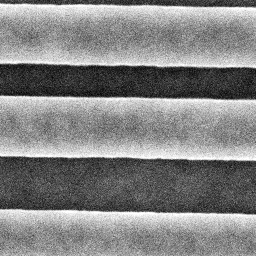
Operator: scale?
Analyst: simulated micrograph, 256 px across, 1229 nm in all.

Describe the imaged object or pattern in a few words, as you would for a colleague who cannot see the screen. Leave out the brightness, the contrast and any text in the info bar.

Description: lines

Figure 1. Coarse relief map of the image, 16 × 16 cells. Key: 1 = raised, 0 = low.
1111111111111110
1111111111111111
1111111111111111
1111111111111111
0000000000000000
0000000000000000
1111111111111111
1111111111111111
1111111111111111
1111111111111111
0000000000000000
0000000000000000
0000000000000000
1111111111111111
1111111111111111
1111111111111111